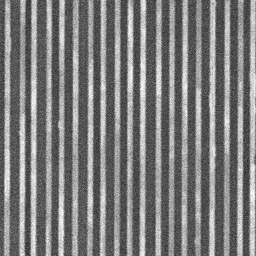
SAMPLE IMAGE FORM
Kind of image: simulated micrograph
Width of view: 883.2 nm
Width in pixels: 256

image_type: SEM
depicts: parallel lines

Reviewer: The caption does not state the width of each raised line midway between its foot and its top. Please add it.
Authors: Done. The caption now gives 15.5 nm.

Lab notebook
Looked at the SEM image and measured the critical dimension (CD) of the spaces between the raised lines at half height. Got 31.1 nm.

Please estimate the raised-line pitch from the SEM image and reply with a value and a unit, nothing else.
47.1 nm